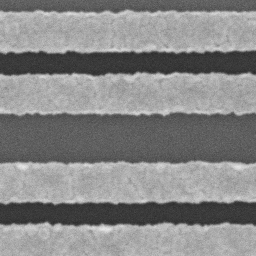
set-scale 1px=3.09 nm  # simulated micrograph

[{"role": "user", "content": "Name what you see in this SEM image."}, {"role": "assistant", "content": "lines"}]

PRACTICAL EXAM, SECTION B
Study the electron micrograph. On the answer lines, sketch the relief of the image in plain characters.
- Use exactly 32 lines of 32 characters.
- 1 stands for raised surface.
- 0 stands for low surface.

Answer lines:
00000000000000000000000000000000
00001100000001011000010000000000
11111111111111111111111111111111
11111111111111111111111111111111
11111111111111111111111111111111
11111111111111111111111111111111
10100011001100000100001000000000
00000000000000000000000000000000
00000000000000000000000000000000
11111111111001111111111111111111
11111111111111111111111111111111
11111111111111111111111111111111
11111111111111111111111111111111
11111111111111111111111111111111
00000000000000000000000000000000
00000000000000000000000000000000
00000000000000000000000000000000
00000000000000000000000000000000
00000000000000000000000000000000
00000000000000000000000000000000
11111011011011110111100111111100
11111111111111111111111111111111
11111111111111111111111111111111
11111111111111111111111111111111
11111111111111111111111111111111
00000000000000000000000000000000
00000000000000000000000000000000
00000000000000000000000000000000
11111111111111111111111111111111
11111111111111111111111111111111
11111111111111111111111111111111
11111111111111111111111111111111